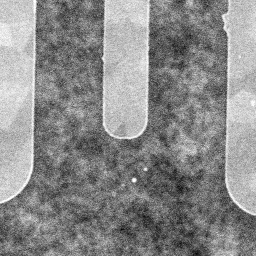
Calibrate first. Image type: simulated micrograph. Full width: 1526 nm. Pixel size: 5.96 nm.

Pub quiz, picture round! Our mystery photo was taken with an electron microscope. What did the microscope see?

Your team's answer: one or a few lines or trenches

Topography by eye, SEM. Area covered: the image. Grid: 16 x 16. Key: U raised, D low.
UUDDDDDUUDDDDDUU
UUDDDDDUUDDDDDUU
UUDDDDDUUDDDDDUU
UUDDDDUUUDDDDDUU
UUDDDDUUUDDDDDUU
UUDDDDUUUDDDDDUU
UUDDDDUUUDDDDDUU
UUDDDDUUUDDDDDUU
UUDDDDDUDDDDDDUU
UUDDDDDDDDDDDDUU
UUDDDDDDDDDDDDUU
UUDDDDDDDDDDDDUU
DDDDDDDDDDDDDDDU
DDDDDDDDDDDDDDDD
DDDDDDDDDDDDDDDD
DDDDDDDDDDDDDDDD